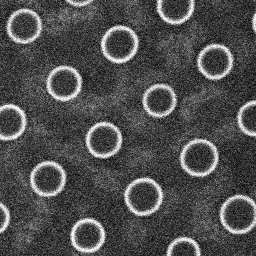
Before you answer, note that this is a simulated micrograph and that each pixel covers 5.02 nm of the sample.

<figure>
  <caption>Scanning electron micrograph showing a regular array of raised bodies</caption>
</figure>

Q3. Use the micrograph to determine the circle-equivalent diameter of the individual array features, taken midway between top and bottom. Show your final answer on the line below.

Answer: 33.6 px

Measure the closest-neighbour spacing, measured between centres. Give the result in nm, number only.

341